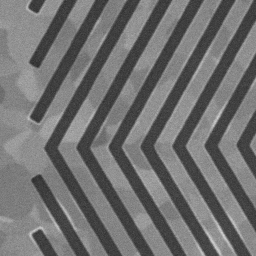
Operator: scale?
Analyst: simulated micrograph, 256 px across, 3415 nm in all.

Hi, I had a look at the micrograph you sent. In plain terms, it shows groups of lines, slits or small figures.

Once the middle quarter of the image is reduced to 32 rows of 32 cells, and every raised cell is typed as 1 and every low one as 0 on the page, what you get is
00111100001111000011110000111100
00111100011111000111110001111100
01111000011110000111100001111000
11111000111100001111100011110000
11110000111100001111000011110001
11110001111100011110000111100001
11100001111000011110000111100001
11000011110000111100001111000011
11000011110000111100011111000111
10000111100001111000011110000111
10000111100011111000111100001111
00001111000011110000111100001111
00011110000111100001111000011110
00011110000111100001111000011110
00111100001111000011110000111100
00111100001111000011110001111100
01111000011110000111100001111000
11111000011110001111100011110000
11110000111100001111000011110000
11110001111100011110000111100001
11100001111000011110000111100001
11100001111000011110000111100001
11110001111100001111000011110000
11110000111100001111000011110000
01111000011110000111100001111000
01111000011111000111110001111100
00111100001111000011110000111100
00111110001111100001111000011110
00011110000111100001111000011110
00001111000011110000111100001111
00001111100011111000111110001111
10000111100001111000011110000111